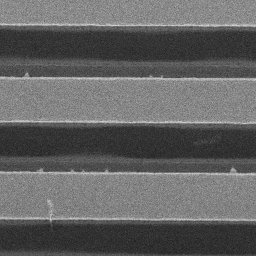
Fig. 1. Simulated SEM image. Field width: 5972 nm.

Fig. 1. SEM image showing lines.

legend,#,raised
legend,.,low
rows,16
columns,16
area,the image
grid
################
################
................
................
................
################
################
################
................
................
................
################
################
################
................
................